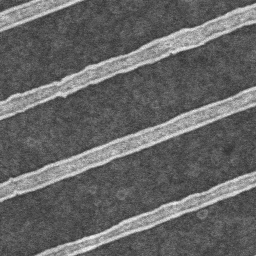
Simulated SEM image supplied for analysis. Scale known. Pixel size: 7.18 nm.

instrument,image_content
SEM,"one or a few lines or trenches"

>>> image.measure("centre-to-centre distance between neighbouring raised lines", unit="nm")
559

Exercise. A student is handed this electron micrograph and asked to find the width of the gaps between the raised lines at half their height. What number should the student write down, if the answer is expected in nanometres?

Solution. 454